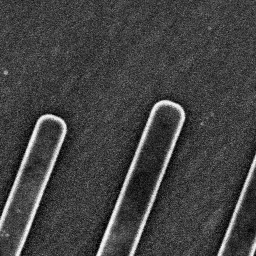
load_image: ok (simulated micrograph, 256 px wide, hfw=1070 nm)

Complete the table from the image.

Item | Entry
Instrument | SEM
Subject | one or a few lines or trenches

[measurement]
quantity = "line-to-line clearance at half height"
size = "314 nanometres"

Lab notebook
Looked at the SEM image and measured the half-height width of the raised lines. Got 0.131 µm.